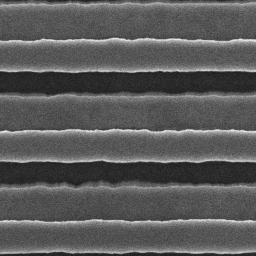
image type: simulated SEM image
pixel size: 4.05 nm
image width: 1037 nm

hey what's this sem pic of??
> lines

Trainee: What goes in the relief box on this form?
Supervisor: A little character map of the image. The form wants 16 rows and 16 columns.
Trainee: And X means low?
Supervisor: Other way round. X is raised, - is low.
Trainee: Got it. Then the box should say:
XXXXXXXXXXXXXXXX
XXXXXXXXXXXXXXXX
XXXXXXXXXXXXXXXX
XXXXXXXXXXXXXXXX
----X-----------
----------------
XXXXXXXXXXXXXXXX
XXXXXXXXXXXXXXXX
XXXXXXXXXXXXXXXX
XXXXXXXXXXXXXXXX
----------------
----------------
XXXXXXXXXXXXXXXX
XXXXXXXXXXXXXXXX
XXXXXXXXXXXXXXXX
XXXXXXXXXXXXXXXX